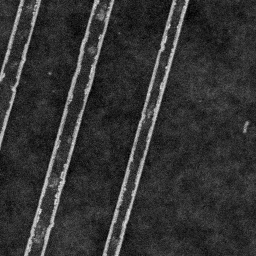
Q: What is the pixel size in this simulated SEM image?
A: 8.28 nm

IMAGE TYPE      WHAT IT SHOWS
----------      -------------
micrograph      one or a few lines or trenches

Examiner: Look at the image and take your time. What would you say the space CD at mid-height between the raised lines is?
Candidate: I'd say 486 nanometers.